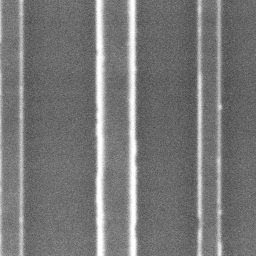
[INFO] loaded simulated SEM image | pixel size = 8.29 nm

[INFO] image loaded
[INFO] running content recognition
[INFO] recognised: lines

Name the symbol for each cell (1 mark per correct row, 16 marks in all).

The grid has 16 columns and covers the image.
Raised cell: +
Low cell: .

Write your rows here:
+.....++....++..
+.....++....++..
+.....++....++..
+.....++....++..
+.....++....++..
+.....++....++..
+.....++....++..
+.....++....++..
+.....++....++..
+.....++....++..
+.....++....++..
+.....++....++..
+.....++....++..
+.....++....++..
+.....++....++..
+.....++....++..